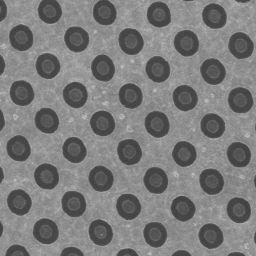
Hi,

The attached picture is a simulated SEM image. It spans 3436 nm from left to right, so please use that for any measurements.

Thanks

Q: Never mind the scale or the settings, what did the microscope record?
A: a regular array of ring-shaped grooves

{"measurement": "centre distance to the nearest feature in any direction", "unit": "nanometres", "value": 512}